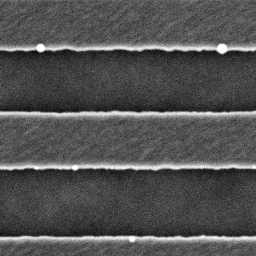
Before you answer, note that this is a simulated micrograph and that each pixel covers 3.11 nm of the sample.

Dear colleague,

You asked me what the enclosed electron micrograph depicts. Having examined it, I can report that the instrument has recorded lines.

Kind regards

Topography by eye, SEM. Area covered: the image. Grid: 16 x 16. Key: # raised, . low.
################
################
################
................
................
................
................
################
################
################
################
................
................
................
................
################